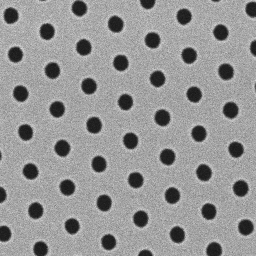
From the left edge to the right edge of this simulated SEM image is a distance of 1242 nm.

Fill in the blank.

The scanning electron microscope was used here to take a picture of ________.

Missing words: a regular array of holes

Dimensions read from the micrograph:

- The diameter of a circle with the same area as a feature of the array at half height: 75.1 nm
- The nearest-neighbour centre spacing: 190 nm